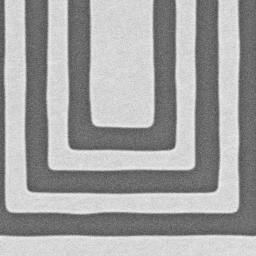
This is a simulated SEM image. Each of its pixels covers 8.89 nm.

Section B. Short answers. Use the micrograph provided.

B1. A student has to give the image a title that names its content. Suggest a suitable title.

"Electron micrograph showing groups of lines, slits or small figures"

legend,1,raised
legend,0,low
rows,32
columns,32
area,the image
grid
01100011000111111110001100011100
01100011000111111110001100011100
01100011000111111110001100011100
01100011000111111110001100011100
01100011000111111110001100011100
01100011000111111110001100011100
01100011000111111110001100011100
01100011000111111110001100011100
01100011000111111110001100011100
01100011000111111110001100011100
01100011000111111110001100011100
01100011000111111110001100011100
01100011000111111110001100011100
01100011000111111110001100001100
01100011000011111110001100001100
01100011000011111110001100001100
01100011000000000000001100001100
01100011000000000000001100001100
01100011100000000000001100001100
01100011111111111111111100001100
01100011111111111111111100001100
01100000000000000000000000011100
01100000000000000000000000011100
01100000000000000000000000011100
01111111111111111111111111111100
01111111111111111111111111111100
00000001111110000111111001111000
00000000000000000000000000000000
00000000000000000000000000000000
00000000000000000000000000000000
11111111111111111111111111111111
11111111111111111111111111111111